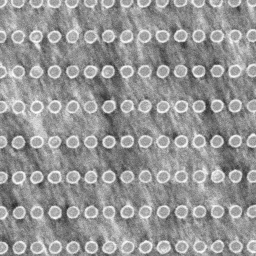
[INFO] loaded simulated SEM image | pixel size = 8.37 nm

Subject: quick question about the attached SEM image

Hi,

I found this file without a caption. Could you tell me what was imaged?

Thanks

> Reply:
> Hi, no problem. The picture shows a regular array of raised bodies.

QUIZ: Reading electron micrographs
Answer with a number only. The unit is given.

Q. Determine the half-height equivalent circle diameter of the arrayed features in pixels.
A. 12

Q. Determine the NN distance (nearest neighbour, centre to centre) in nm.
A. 149